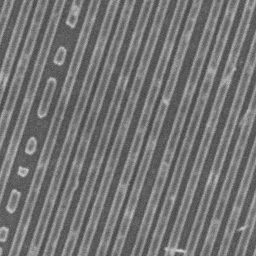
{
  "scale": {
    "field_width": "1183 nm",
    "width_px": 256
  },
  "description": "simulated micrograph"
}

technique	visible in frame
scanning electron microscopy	parallel lines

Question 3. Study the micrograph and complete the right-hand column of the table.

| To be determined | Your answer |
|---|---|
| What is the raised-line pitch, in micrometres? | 0.0764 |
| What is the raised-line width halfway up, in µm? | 0.0424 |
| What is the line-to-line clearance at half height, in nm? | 34.1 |